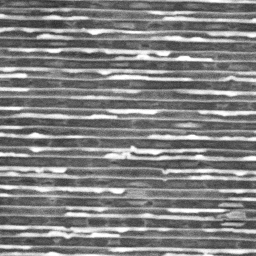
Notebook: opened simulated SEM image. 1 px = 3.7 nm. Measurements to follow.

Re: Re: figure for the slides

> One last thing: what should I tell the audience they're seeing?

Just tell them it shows parallel lines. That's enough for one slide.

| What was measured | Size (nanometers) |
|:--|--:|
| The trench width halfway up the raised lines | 36.6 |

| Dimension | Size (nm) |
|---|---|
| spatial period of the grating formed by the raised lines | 73.2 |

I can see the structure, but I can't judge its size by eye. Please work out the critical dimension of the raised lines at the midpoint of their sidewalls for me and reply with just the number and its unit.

37 nanometers